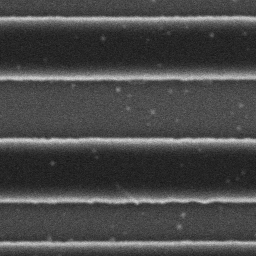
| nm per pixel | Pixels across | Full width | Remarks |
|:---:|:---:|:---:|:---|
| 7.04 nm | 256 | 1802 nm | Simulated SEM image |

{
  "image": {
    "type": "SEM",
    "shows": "lines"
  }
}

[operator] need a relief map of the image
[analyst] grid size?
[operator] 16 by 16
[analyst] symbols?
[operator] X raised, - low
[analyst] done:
----------------
XXXXXXXXXXXXXXXX
XXXXXXXXXXXXXXXX
XXXXXXXXXXXXXXXX
XXXXXXXXXXXXXXXX
----------------
----------------
----------------
----------------
XXXXXXXXXXXXXXXX
XXXXXXXXXXXXXXXX
XXXXXXXXXXXXXXXX
XXXXXXXXXXXXXXXX
----------------
----------------
XXXXXXXXXXXXXXXX